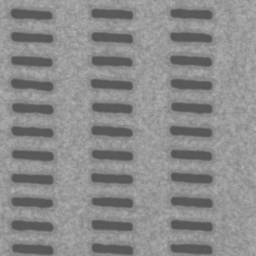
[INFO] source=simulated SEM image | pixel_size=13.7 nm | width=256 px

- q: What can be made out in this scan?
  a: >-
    a regular array of holes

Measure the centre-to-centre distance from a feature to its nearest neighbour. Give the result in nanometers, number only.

320